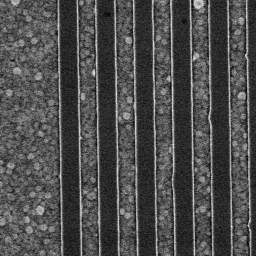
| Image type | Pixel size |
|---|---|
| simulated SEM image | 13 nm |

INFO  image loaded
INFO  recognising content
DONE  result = parallel lines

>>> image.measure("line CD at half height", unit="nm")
258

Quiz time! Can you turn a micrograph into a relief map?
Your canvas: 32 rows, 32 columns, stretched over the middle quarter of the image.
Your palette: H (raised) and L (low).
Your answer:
HHHHLLLLHHHHHLLLLLHHHHLLLLLHHHHH
HHHHLLLLHHHHHLLLLLHHHHLLLLLHHHHH
HHHHLLLHHHHHHLLLLHHHHHLLLLLHHHHH
HHHHLLLLHHHHHLLLLHHHHHLLLLHHHHHH
HHHHLLLLHHHHHLLLLLHHHHLHLLLHHHHH
HHHHLLLLHHHHHLLLLLHHHHLLLLLHHHHH
HHHHLLLLHHHHHLLHLLHHHHHLLLLHHHHH
HHHHLLLLHHHHHLLLLLHHHHHLLLLHHHHH
HHHHHLLLHHHHHLLLHLHHHHHLLLLHHHHH
HHHHLLLLHHHHHLLLLLHHHHHLLLLHHHHH
HHHHLLLLHHHHHLLLLLHHHHHLLLLHHHHH
HHHHLLLLHHHHHLLLLLHHHHHLLLLHHHHH
HHHHLLLLHHHHHLLHLLHHHHHLLLLHHHHH
HHHHLLLLHHHHHLLHLLHHHHLLLLLHHHHH
HHHHLLLLHHHHHLLLLLHHHHHLLLLHHHHH
HHHHLLLLHHHHHLLLLLHHHHHLLLLHHHHH
HHHHLLLLHHHHHLLLLLHHHHHLLLLHHHHH
HHHHLLLLHHHHHLLLLLHHHHHLLLLHHHHH
HHHHLLLLHHHHHLLLLLHHHHHLLLLHHHHH
HHHHLLLLHHHHHLLLLLHHHHHLLLLHHHHH
HHHHLLLLLHHHHLLLLLHHHHHLLLLHHHHH
HHHHLLLLLHHHHLLLLLHHHHHLLLLHHHHH
HHHHLLLLLHHHHLLLLLHHHHHLLLLHHHHH
HHHHLLLLLHHHHLLLLLHHHHHLLLLHHHHH
HHHHLLLLLHHHHLLLLLHHHHHLLLLHHHHH
HHHHLLLLLHHHHLLLLLHHHHHLLLLHHHHH
HHHHLLLLLHHHHLLLLLHHHHHLLLLHHHHH
HHHHLLLLLHHHHLLLLLHHHHHLLLLHHHHH
HHHHLLLLLHHHHLLLLLHHHHHLLLLHHHHH
HHHHLLLLLHHHHLLLLLHHHHHLLLLHHHHH
HHHHLLLLLHHHHLLLLLHHHHHLLLLHHHHH
HHHHLLLLLHHHHHLLLLHHHHHLLLLHHHHH